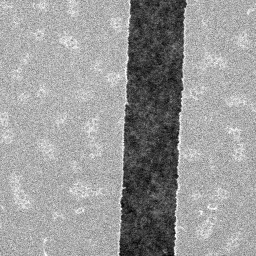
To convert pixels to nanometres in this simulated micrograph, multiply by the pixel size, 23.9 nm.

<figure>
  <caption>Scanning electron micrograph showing one or a few lines or trenches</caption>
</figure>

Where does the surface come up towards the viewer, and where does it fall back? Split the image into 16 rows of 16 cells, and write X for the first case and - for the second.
XXXXXXXX----XXXX
XXXXXXXX----XXXX
XXXXXXXX----XXXX
XXXXXXXX----XXXX
XXXXXXXX---XXXXX
XXXXXXXX---XXXXX
XXXXXXXX---XXXXX
XXXXXXXX---XXXXX
XXXXXXXX---XXXXX
XXXXXXXX---XXXXX
XXXXXXXX---XXXXX
XXXXXXXX---XXXXX
XXXXXXXX---XXXXX
XXXXXXXX---XXXXX
XXXXXXX----XXXXX
XXXXXXX----XXXXX